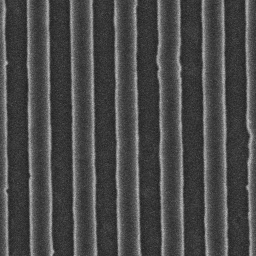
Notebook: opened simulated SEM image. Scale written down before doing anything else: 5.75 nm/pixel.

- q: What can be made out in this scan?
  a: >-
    parallel lines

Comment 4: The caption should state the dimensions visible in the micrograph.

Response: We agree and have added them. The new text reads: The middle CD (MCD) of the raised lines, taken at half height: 0.123 µm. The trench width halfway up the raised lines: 129 nm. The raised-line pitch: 252 nm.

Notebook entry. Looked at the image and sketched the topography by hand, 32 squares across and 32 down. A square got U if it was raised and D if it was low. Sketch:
UDDUUUDDDUUDDDUUUDDDUUDDDUUUDDDU
UDDDUUDDDUUUDDUUUDDDUUDDDUUUDDDU
UDDDUUDDDUUUDDUUUDDDUUDDDUUUDDDU
UDDDUUDDDUUUDDUUUDDDUUDDDUUUDDDU
UDDDUUDDDUUDDDUUUDDDUUDDDUUUDDDU
UDDUUUDDDUUUDDUUUDDDUUDDDUUUDDDU
UDDUUUDDDUUDDDUUUDDDUUDDDUUUDDDU
UDDUUUDDDUUUDDDUUDDDUUDDDUUUDDDU
UDDUUUDDDUUUDDDUUDDDUUUDDUUUDDDU
UDDDUUDDDUUUDDDUUDDDUUUDDUUUDDDU
UDDDUUDDDUUUDDDUUDDDUUUDDUUUDDDU
UDDDUUDDDUUUDDUUUDDDUUUDDUUUDDDU
UDDDUUDDDUUUDDUUUDDDUUUDDDUUDDDU
UDDDUUDDDUUUDDUUUDDDUUUDDDUUDDDU
UDDDUUDDDUUUDDDUUDDDUUUDDDUUDDDU
UDDDUUDDDUUUDDDUUDDDUUUDDDUUDDDU
UDDDUUDDDUUUDDDUUDDDUUUDDDUUDDDU
UDDDUUDDDUUUDDDUUDDDUUUDDDUUDDDU
UDDDUUDDDUUUDDDUUDDDUUUDDDUUDDDU
UDDDUUDDDUUUDDDUUDDDUUUDDDUUDDDU
UDDDUUDDDUUUDDDUUDDDUUUDDDUUDDDU
UDDDUUDDDUUUDDDUUDDDUUUDDDUUDDDU
UDDDUUDDDUUUDDDUUDDDUUUDDDUUDDDU
UDDDUUDDDUUUDDDUUDDDUUUDDDUUDDDU
UDDDUUDDDUUUDDDUUDDDUUUDDDUUDDDU
UDDDUUDDDUUUDDDUUDDDUUUDDDUUDDDU
UDDDUUDDDUUUDDDUUDDDUUUDDDUUDDDU
UDDDUUDDDUUUDDDUUDDDUUUDDDUUDDDU
UDDDUUDDDUUUDDDUUDDDUUUDDDUUDDDU
UDDDUUDDDUUUDDDUUDDDUUUDDDUUDDDU
UDDDUUUDDUUUDDDUUDDDUUUDDDUUDDDU
UDDDUUUDDUUUDDDUUUDDUUUDDDUUDDDU